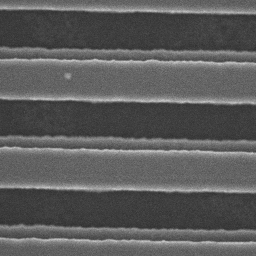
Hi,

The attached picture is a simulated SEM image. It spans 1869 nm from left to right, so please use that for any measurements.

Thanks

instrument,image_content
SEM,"lines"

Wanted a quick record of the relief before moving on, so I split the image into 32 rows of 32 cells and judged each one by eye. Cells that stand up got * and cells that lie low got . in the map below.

********************************
.....................***********
................................
................................
................................
................................
******************.**...........
********************************
********************************
********************************
********************************
********************************
...........*********************
................................
................................
................................
................................
****************................
********************************
********************************
********************************
********************************
********************************
.......*************************
................................
................................
................................
................................
*******.........................
********************************
********************************
********************************